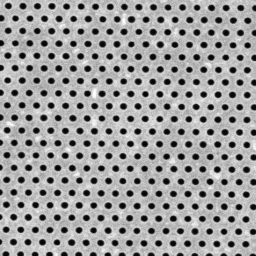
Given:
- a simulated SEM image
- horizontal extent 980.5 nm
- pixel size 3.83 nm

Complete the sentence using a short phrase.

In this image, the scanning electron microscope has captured a regular array of holes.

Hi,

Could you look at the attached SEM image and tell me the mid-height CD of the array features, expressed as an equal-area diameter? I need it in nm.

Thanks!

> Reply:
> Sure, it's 24.4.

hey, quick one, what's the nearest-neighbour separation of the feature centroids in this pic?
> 54.2 nm